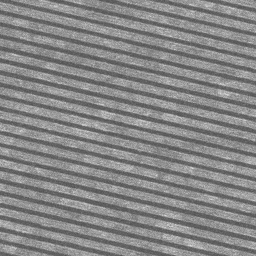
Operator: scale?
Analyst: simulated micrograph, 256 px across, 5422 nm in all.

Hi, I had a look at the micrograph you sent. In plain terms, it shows parallel lines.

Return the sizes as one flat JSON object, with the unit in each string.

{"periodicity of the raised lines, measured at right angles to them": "11.8 pixels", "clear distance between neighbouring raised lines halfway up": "108 nm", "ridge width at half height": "142 nm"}